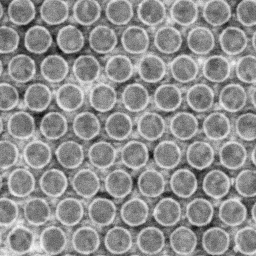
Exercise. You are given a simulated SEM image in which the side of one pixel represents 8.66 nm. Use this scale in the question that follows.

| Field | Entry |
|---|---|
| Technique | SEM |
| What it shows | a regular array of raised bodies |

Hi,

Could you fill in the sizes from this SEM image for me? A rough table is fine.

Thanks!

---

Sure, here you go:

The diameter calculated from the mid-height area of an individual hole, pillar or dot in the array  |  226 nm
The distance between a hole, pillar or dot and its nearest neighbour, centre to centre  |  280 nm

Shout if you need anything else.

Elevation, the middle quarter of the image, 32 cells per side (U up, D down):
UDDUUUUUUDDUUUUUUDDUUUUUUDDUUUUU
UDDUUUUUUDDUUUUUUDDUUUUUUDDUUUUU
DDDUUUUUUDDUUUUUUDDUUUUUUDDUUUUU
DDDUUUUUDDDDUUUUDDDDUUUUDDDDUUUU
DDDDDUDDDDDDDDDDDDDDDDDDDDDDDDDD
UUUDDDDDUUUDDDDDUUUDDDDDDUUDDDDD
UUUUDDDUUUUUDDDUUUUUDDDUUUUUUDDU
UUUUDDDUUUUUUDDUUUUUUDDUUUUUUDDU
UUUUUDDUUUUUUDDUUUUUUDDUUUUUUDDU
UUUUDDDUUUUUUDDUUUUUUDDUUUUUUDDU
UUUUDDDUUUUUDDDUUUUUDDDUUUUUUDDD
DUDDDDDDUUUDDDDDDUUDDDDDDDDDDDDD
DDDDUUUDDDDDDUDDDDDDDUUDDDDDDUUD
DDDUUUUUDDDUUUUUDDDUUUUUDDDUUUUU
DDUUUUUUUDDUUUUUUDDUUUUUUDDUUUUU
DDUUUUUUUDUUUUUUUDDUUUUUUDDUUUUU
DDDUUUUUUDDUUUUUUDDUUUUUUDDUUUUU
DDDUUUUUDDDUUUUUDDDUUUUUDDDDUUUU
DDDDDUUDDDDDDUUDDDDDUUUDDDDDDUUD
DDDDDDDDDDDDDDDDDDDDDDDDDUDDDDDD
UUUUDDDUUUUUDDDDUUUUDDDDUUUUDDDD
UUUUDDDUUUUUDDDUUUUUDDDUUUUUUDDU
UUUUUDUUUUUUUDUUUUUUUDDUUUUUUDDU
UUUUUDUUUUUUDDUUUUUUUDDUUUUUUDDU
UUUUDDDUUUUUDDDUUUUUDDDUUUUUUDDU
UUUDDDDDUUUDDDDDUUUDDDDDUUUDDDDD
DDDDDDDDDDDDDDDDDDDDDDDDDDDDDDDD
DDDUUUUUDDDDUUUUDDDDUUUUDDDDUUUU
DDDUUUUUDDDUUUUUDDDUUUUUUDDUUUUU
UDUUUUUUUDUUUUUUUDDUUUUUUDDUUUUU
DDUUUUUUUDDUUUUUUDDUUUUUUDDUUUUU
DDDUUUUUDDDUUUUUUDDUUUUUUDDUUUUU